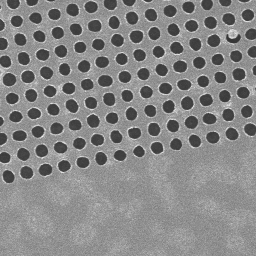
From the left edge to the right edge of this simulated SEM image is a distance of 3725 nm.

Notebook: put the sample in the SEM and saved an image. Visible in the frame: a regular array of holes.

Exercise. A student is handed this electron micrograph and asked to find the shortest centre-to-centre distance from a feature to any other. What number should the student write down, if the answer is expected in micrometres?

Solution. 0.269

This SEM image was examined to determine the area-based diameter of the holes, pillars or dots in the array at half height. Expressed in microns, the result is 0.181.